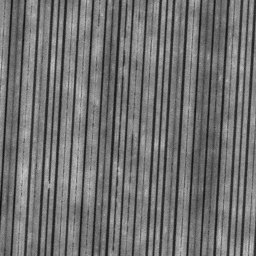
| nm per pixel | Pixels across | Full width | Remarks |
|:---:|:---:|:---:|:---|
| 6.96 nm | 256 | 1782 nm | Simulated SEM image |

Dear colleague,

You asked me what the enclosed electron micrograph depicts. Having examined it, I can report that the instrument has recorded parallel lines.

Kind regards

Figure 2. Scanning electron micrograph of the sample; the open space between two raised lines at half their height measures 12.2 nm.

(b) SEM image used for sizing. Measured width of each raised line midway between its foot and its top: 37.4 nm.